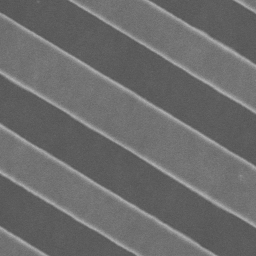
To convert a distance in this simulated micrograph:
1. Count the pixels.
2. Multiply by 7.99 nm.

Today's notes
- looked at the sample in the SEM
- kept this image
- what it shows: lines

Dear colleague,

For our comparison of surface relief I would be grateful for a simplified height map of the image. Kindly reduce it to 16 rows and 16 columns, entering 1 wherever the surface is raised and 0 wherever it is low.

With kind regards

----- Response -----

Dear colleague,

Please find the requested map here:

0000011111000001
1000000111110000
1110000011111000
1111000000111110
1111110000001111
0011111100000111
0001111110000001
0000011111100000
1000000111111000
1110000011111100
1111000000111111
0111110000001111
0001111100000111
0000011110000001
1000001111100000
1100000011111000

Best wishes